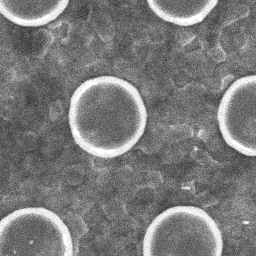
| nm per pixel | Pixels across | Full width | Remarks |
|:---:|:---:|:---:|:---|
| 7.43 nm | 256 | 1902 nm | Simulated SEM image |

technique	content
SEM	raised bodies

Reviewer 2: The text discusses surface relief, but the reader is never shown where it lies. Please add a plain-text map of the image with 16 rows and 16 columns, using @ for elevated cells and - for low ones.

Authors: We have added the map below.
@@@@------@@@---
----------------
----------------
----------------
----------------
-----@@@------@@
-----@@@@-----@@
-----@@@@-----@@
-----@@@@-----@@
------@--------@
----------------
----------------
----------------
-@@-------@@@---
@@@@-----@@@@@--
@@@@-----@@@@@--